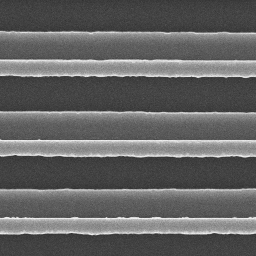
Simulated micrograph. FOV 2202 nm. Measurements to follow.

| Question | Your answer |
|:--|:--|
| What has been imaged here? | lines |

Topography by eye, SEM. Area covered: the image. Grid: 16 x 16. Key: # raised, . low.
................
................
################
################
################
................
................
################
################
################
................
................
################
################
################
................